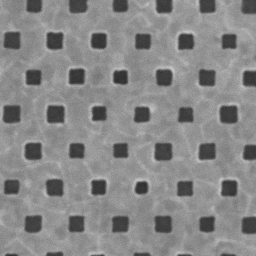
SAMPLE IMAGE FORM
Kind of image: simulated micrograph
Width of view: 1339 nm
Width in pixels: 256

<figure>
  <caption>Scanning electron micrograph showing a regular array of holes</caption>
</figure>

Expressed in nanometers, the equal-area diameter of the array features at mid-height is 95.1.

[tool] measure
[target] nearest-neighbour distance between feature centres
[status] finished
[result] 219 nm